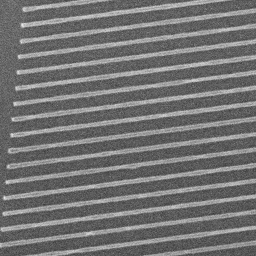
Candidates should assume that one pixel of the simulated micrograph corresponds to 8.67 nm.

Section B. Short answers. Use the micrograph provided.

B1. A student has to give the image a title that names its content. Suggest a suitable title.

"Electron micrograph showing parallel lines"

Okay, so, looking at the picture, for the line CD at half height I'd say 31.1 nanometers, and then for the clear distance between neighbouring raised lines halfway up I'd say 99.9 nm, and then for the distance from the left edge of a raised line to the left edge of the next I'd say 133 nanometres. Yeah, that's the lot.